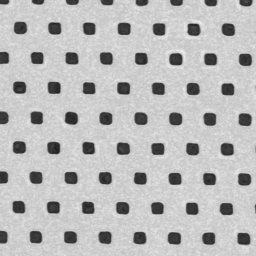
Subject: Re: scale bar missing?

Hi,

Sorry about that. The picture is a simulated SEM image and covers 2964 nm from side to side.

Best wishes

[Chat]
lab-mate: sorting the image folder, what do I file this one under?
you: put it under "a regular array of holes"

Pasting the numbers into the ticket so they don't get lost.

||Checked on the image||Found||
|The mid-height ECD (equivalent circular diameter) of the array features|156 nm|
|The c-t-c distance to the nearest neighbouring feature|395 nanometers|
